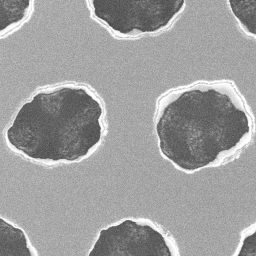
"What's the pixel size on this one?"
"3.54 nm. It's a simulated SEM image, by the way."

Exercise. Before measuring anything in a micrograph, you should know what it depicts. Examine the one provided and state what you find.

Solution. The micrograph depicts holes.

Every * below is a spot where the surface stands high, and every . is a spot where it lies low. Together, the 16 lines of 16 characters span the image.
..****.....***..
.******...*****.
****************
****************
****************
************.***
**....****.....*
*.....****.....*
*.....****.....*
*....*****....**
***********.****
****************
****************
****************
.*****....******
..****.....****.